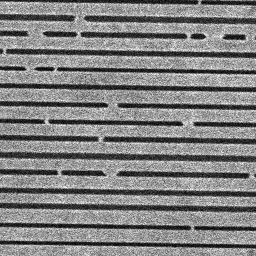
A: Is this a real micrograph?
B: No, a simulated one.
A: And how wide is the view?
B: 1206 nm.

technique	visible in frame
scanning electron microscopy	parallel lines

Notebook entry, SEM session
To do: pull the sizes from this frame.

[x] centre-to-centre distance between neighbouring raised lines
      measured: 81.9 nanometres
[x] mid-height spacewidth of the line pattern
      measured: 21.8 nm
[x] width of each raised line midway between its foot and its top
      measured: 60.1 nm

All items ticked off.